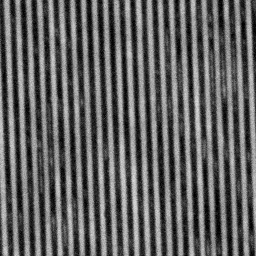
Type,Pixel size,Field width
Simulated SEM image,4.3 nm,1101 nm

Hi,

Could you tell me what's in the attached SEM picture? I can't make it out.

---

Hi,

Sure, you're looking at parallel lines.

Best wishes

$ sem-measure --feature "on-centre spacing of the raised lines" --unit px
11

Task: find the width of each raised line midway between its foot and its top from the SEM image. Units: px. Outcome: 4.26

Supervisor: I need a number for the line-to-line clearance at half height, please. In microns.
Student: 0.0295